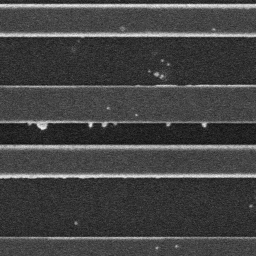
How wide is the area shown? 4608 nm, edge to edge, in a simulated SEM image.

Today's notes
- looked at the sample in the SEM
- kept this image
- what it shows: lines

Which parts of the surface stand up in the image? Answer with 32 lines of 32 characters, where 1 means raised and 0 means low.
00000000000000000000000000000000
11111111111111111111111111111111
11111111111111111111111111111111
11111111111111111111111111111111
11111111111111111111111111111111
00000000000000000000000000000000
00000000000000000000000000000000
00000000000000000000000000000000
00000000000000000000000000000000
00000000000000000000000000000000
00000000000000000000000000000000
11111111111111111111111111111111
11111111111111111111111111111111
11111111111111111111111111111111
11111111111111111111111111111111
00000000000000000000000000000000
00000000000000000000000000000000
00000000000000000000000000000000
11111111111111111111111111111111
11111111111111111111111111111111
11111111111111111111111111111111
11111111111111111111111111111111
00000000000000000000000000000000
00000000000000000000000000000000
00000000000000000000000000000000
00000000000000000000000000000000
00000000000000000000000000000000
00000000000000000000000000000000
00000000000000000000000000000000
00000000000000000000000000000000
11111111111111111111111111111111
11111111111111111111111111111111